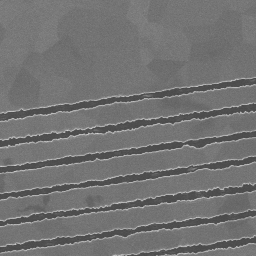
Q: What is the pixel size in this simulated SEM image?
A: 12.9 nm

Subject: parallel lines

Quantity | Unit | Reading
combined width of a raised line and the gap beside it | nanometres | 339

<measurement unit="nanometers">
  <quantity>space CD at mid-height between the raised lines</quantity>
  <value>84.7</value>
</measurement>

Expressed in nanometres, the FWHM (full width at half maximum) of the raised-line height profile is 251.